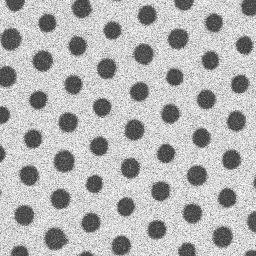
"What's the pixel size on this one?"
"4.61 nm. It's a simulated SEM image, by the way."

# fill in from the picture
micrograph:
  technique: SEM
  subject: a regular array of holes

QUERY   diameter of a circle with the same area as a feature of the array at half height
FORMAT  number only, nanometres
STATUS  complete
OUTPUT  87.8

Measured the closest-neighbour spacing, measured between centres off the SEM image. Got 0.172 µm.